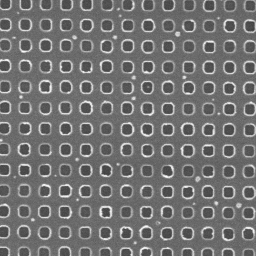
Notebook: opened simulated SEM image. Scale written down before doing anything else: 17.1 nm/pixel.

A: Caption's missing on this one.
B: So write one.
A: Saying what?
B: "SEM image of a regular array of holes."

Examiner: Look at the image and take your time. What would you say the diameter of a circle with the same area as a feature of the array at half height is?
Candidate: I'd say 190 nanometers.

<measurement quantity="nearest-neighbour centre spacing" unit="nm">347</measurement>